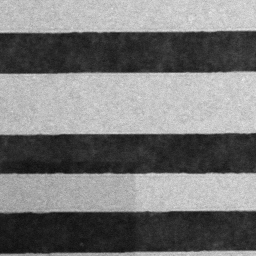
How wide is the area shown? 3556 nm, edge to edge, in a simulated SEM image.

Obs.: lines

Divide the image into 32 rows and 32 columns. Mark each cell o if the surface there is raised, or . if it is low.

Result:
oooooooooooooooooooooooooooooooo
oooooooooooooooooooooooooooooooo
oooooooooooooooooooooooooooooooo
oooooooooooooooooooooooooooooooo
................................
................................
................................
................................
................................
oooooooooooooooooooooooooooooooo
oooooooooooooooooooooooooooooooo
oooooooooooooooooooooooooooooooo
oooooooooooooooooooooooooooooooo
oooooooooooooooooooooooooooooooo
oooooooooooooooooooooooooooooooo
oooooooooooooooooooooooooooooooo
oooooooooooooooooooooooooooooooo
................................
................................
................................
................................
................................
oooooooooooooooooooooooooooooooo
oooooooooooooooooooooooooooooooo
oooooooooooooooooooooooooooooooo
oooooooooooooooooooooooooooooooo
................................
................................
................................
................................
................................
............................oooo